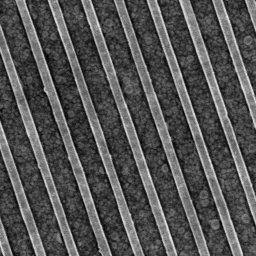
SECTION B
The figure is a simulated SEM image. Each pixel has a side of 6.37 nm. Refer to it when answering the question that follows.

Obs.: parallel lines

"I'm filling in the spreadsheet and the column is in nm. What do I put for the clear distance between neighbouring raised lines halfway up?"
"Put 143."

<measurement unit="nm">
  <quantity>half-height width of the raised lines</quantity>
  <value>55.1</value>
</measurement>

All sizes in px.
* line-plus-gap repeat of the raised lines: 31.1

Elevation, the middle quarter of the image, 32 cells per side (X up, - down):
--XX------XX------XX------XXX---
--XX------XXX------XX------XX---
--XXX------XX------XX------XX---
---XX------XX------XX------XX---
---XX------XXX------XX------XX--
---XXX------XX------XX------XX--
----XX------XX------XX------XXX-
----XX------XXX-----XXX------XX-
----XXX------XX------XX------XX-
-----XX------XX------XXX-----XXX
-----XX------XXX-----XXX------XX
-----XXX------XX------XX------XX
------XX------XX------XXX-----XX
------XX------XXX-----XXX------X
------XXX------XX------XX------X
X------XX------XXX-----XXX-----X
X------XX------XXX-----XXX------
X------XXX------XX------XX------
XX------XX------XX------XXX-----
XX------XX------XXX------XX-----
XXX-----XXX------XX------XX-----
-XX------XX------XX------XXX----
-XX------XX------XXX------XX----
-XXX-----XXX------XX------XX----
--XX------XX------XX------XXX---
--XX------XX------XXX------XX---
--XXX-----XXX------XX------XX---
---XX------XX------XX------XXX--
---XX------XX------XXX-----XXX--
---XXX------XX------XX------XX--
----XX------XX------XX------XXX-
----XX------XX------XXX-----XXX-